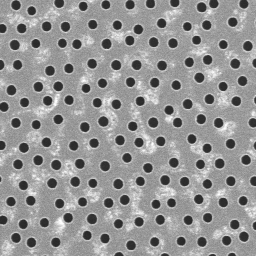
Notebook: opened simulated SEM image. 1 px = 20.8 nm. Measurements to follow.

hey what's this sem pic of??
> a regular array of holes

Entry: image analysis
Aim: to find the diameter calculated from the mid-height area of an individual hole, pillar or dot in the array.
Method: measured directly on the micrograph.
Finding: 208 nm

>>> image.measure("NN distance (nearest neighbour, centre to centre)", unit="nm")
385